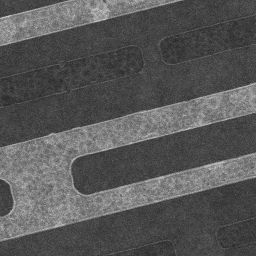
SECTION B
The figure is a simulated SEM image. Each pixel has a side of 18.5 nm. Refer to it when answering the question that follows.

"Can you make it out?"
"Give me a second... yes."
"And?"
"one or a few lines or trenches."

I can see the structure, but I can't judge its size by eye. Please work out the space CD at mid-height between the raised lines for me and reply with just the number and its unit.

723 nm